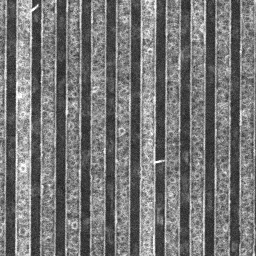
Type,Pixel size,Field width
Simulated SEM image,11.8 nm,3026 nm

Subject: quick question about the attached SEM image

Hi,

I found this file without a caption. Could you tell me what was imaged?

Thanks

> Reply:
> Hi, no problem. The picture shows parallel lines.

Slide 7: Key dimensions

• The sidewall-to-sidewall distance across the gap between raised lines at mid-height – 121 nanometres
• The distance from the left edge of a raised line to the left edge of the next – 294 nanometers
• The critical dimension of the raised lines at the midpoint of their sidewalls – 170 nm